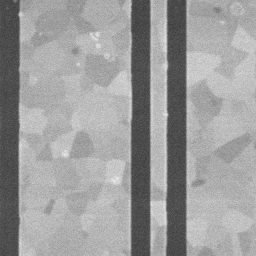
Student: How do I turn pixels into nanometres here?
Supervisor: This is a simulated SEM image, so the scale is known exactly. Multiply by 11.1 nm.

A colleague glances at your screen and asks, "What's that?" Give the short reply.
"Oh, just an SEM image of lines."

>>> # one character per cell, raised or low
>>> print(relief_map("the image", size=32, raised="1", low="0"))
00011111111111110001100111111111
00111111111111110001100111111111
00011111111111110001100111111111
00011111111111110001100111111111
00011111111111110001100111111111
00011111111111110001100111111111
00011111111111110001100111111111
00011111111111110001100111111111
00111111111111110001100111111111
00011111111111110001100111111111
00011111111111110001100111111111
00011111111111110001100111111111
00011111111111110001100111111111
00111111111111110001100111111111
00111111111111110001100111111111
00111111111111110001100111111111
00111111111111110001100111111111
00111111111111110001100111111111
00111111111111110001100111111111
00111111111111110001100111111111
00111111111111110001100111111111
00111111111111110001100111111111
00111111111111110001100111111111
00111111111111110001100111111111
00111111111111110001100111111111
00111111111111110001100111111111
00111111111111110001100111111111
00011111111111110001100111111111
00111111111111110001100111111111
00111111111111110001100111111111
00111111111111110001100111111111
00111111111111110001100111111111